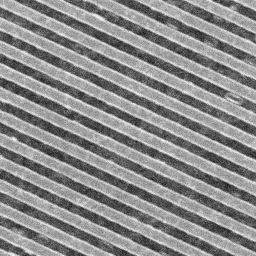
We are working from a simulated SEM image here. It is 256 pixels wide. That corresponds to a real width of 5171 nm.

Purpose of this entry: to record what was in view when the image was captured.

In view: parallel lines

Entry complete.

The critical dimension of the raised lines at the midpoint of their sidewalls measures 222 nanometers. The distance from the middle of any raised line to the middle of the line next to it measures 424 nanometres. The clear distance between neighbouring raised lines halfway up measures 201 nm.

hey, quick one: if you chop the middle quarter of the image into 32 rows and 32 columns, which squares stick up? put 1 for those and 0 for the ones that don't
00011111110000001111110000001111
00000011111100000011111100000001
11000000111111000000111111100000
11110000001111110000001111111000
11111100000011111110000011111110
00111111000000111111100000111111
00101111110000001111111000000111
00000011111110000011111110000001
11000000111111100000011111100000
11111000001111111000000111111000
11111110000011111110000001111110
00111111100000011111100000011111
00001111111000000111111000000111
10000001111110000001111110000001
11100000011111100000011111110000
11111000000111111000000111111000
01111110000001111111000001111111
00011111100000011111110000011111
00000111111000000111111100000011
10000001111110000001111111000000
11100000011111100000001111110000
11111000000111111100000011111100
01111111000001111111000000111111
00011111110000001111110000001111
00000111111100000011111100000011
10000000111111000000111111000000
11110000001111110000001111110000
11111100000011111100000011111100
01111111000000111111000000111111
00001111110000001111110000001111
00000011111100000011111100000001
11000000111111000000111111100000